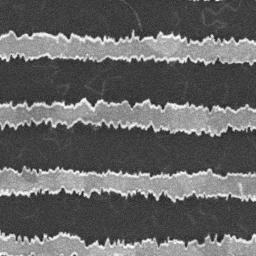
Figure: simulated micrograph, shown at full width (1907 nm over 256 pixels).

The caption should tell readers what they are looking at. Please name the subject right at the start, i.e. one or a few lines or trenches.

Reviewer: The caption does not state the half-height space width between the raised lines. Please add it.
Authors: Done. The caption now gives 349 nm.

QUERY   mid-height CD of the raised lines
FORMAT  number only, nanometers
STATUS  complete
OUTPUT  153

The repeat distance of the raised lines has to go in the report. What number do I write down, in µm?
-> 0.5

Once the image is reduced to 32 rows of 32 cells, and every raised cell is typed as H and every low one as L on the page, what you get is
LLLLLLLLLLLLLLLLLLLLLLLLLLLLLLLL
LLLLLLLLLLLLLLLLLLLLLLLLLLLLLLLL
LLLLLLLLLLLLLLLLLLLLLLLLLLLLLLLL
LLLLLLLLLLLLLLLLLLLLLLLLLLLLLLLL
HHLLHHLLLLLLLLLLLLLLHLLLLLLLLLLL
HHHHHHHHHHHHHHHHHHHHHHHHHHHHHHHH
HHHHHHHHHHHHHHHHHHHHHHHHHHHHHHHH
LLLLLLLLLLLLHLLLLLLLLLHLLHHHHHHH
LLLLLLLLLLLLLLLLLLLLLLLLLLLLLLLL
LLLLLLLLLLLLLLLLLLLLLLLLLLLLLLLL
LLLLLLLLLLLLLLLLLLLLLLLLLLLLLLLL
LLLLLLLLLLLLLLLLLLLLLLLLLLLLLLLL
LLLLLLLLLLLLLLLLLLLLLLLLLLLLLLLL
HHHHHHHHHHHHHHHHHHHHLHHHHHLLLLHL
HHHHHHHHHHHHHHHHHHHHHHHHHHHHHHHH
HHHLLLLLHLLLLLHHHHHHHHHHHHHHHHHH
LLLLLLLLLLLLLLLLLLLLLLLLHLHHLLLL
LLLLLLLLLLLLLLLLLLLLLLLLLLLLLLLL
LLLLLLLLLLLLLLLLLLLLLLLLLLLLLLLL
LLLLLLLLLLLLLLLLLLLLLLLLLLLLLLLL
LLLLLLLLLLLLLLLLLLLLLLLLLLLLLLLL
HHLHHLHHHLLLLLLLLLLLLLLLLLLLLLLL
HHHHHHHHHHHHHHHHHHHHHHHHHHHHHHHH
HHHHHHHHHHHHHHHHHHHHHHHHHHHHHHHH
LLLLLLLLLLLLLLLLLLLLLHHLLLLLLHHH
LLLLLLLLLLLLLLLLLLLLLLLLLLLLLLLL
LLLLLLLLLLLLLLLLLLLLLLLLLLLLLLLL
LLLLLLLLLLLLLLLLLLLLLLLLLLLLLLLL
LLLLLLLLLLLLLLLLLLLLLLLLLLLLLLLL
LLLLLLLHLLLLLLLLLLLLLLLLLLLLLLLL
HHHHHHHHHHLLLHHLLHHHHHHLHHHHHHHH
HHHHHHHHHHHHHHHHHHHHHHHHHHHHHHHH